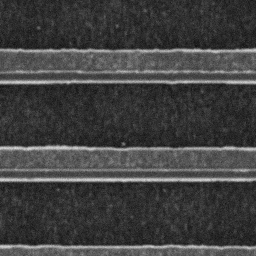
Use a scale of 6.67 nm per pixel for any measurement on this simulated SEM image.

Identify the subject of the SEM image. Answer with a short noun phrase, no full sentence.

lines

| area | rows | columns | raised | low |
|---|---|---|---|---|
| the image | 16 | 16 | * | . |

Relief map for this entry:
................
................
................
****************
****************
................
................
................
................
****************
****************
................
................
................
................
****************